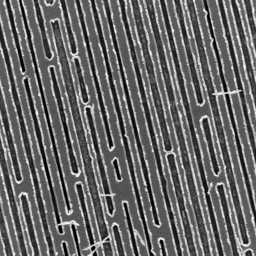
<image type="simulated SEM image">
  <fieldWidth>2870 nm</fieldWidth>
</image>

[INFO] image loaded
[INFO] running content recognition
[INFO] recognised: parallel lines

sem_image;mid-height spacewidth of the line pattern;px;4.99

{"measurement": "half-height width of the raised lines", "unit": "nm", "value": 104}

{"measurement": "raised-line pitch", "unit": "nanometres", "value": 154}